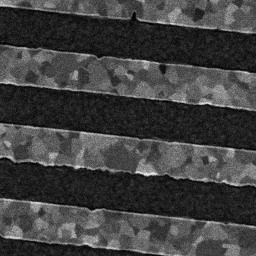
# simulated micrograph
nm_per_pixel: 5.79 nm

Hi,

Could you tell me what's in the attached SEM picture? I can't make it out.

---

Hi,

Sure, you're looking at one or a few lines or trenches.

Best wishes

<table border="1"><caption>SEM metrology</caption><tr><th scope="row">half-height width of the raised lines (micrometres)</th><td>0.211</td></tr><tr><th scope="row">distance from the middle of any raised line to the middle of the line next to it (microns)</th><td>0.443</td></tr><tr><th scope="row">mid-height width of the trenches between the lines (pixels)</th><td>40.6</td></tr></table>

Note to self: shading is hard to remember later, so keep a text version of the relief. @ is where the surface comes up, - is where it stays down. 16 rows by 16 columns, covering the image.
-@@@@@@@@@@@@@@@
----------@@@@@@
----------------
@@@@@@----------
@@@@@@@@@@@@@@@-
---@@@@@@@@@@@@@
-------------@@@
----------------
@@@@@@@---------
@@@@@@@@@@@@@@@@
-----@@@@@@@@@@@
--------------@@
@---------------
@@@@@@@@@@------
@@@@@@@@@@@@@@@@
-------@@@@@@@@@